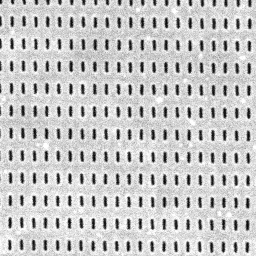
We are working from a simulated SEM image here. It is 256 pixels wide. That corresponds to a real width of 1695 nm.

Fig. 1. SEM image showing a regular array of holes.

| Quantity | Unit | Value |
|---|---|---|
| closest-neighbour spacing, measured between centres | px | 11.7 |